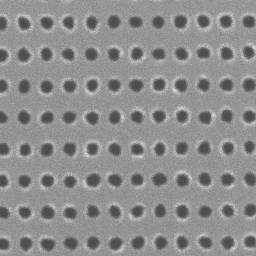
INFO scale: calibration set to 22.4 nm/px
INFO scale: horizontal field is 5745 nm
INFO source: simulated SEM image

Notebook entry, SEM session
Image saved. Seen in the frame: a regular array of holes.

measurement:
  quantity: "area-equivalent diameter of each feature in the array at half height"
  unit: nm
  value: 310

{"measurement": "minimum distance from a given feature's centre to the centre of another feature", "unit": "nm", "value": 500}